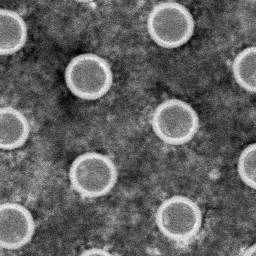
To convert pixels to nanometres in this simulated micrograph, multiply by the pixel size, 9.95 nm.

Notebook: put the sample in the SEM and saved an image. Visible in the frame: raised bodies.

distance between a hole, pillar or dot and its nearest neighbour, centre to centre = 0.959 microns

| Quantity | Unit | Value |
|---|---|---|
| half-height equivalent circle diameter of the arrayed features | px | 41.7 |